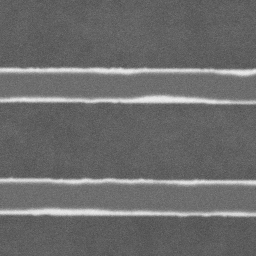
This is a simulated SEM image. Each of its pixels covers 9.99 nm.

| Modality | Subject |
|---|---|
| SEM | lines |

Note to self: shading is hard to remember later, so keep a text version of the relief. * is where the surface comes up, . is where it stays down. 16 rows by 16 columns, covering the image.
................
................
................
................
****************
****************
................
................
................
................
................
****************
****************
................
................
................